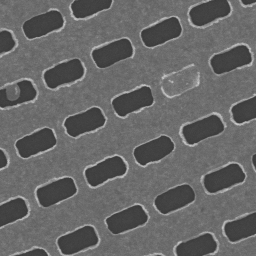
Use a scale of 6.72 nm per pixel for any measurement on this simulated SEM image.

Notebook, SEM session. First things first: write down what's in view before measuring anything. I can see a regular array of holes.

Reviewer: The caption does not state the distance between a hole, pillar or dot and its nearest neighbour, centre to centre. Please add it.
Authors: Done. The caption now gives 353 nanometers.